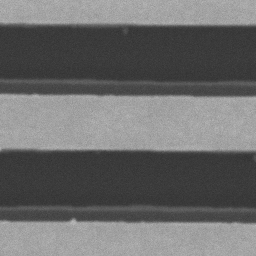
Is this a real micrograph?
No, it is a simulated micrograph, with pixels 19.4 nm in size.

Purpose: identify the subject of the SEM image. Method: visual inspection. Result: lines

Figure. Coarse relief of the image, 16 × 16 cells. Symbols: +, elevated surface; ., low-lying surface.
++++++++++++++++
........++++++++
................
................
................
................
++++++++++++++++
++++++++++++++++
++++++++++++++++
................
................
................
................
................
++++++++++++++++
++++++++++++++++